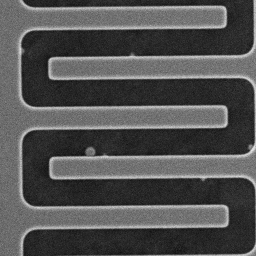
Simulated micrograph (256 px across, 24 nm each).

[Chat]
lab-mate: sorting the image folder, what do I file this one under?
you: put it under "groups of lines, slits or small figures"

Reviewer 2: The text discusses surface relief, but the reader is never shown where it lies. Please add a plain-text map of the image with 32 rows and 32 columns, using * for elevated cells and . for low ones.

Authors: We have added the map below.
***.............................
****************************....
****************************....
***************************.....
***.............................
***.............................
***............................*
***...**************************
***...**************************
***...**************************
***............................*
***.............................
***.............................
****************************....
****************************....
****************************....
****............................
***.............................
***.............................
***....................*********
***...**************************
***...**************************
***............................*
***.............................
***.............................
****............................
****************************....
****************************....
***********.....................
***.............................
***.............................
***............................*